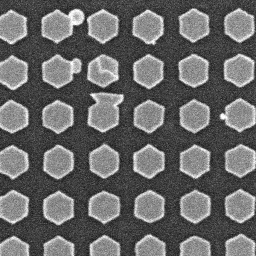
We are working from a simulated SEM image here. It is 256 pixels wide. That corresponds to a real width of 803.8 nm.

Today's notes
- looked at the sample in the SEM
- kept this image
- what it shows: a regular array of raised bodies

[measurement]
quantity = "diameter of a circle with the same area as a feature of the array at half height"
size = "30.9 px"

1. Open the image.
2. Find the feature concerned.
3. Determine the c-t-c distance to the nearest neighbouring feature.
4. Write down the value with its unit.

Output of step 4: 0.141 microns